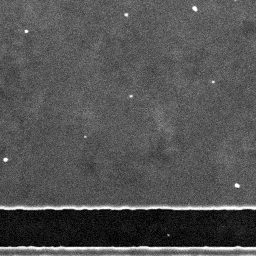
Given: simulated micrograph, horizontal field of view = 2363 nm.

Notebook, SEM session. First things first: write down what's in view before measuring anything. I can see lines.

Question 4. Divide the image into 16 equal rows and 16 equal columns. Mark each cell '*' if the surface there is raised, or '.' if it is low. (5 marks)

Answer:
****************
****************
****************
****************
****************
****************
****************
****************
****************
****************
****************
****************
****************
................
................
****************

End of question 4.